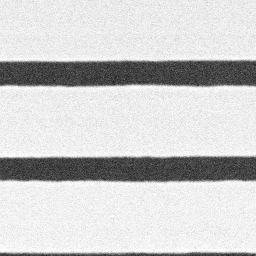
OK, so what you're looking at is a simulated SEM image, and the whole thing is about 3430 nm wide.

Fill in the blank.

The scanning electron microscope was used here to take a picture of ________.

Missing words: lines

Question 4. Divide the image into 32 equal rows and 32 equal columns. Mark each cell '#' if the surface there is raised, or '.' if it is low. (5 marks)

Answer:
################################
################################
################################
################################
################################
################################
################################
#############...................
................................
................................
................................
################################
################################
################################
################################
################################
################################
################################
################################
#######.#####......##...........
................................
................................
................................
################################
################################
################################
################################
################################
################################
################################
################################
........###........##..........#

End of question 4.